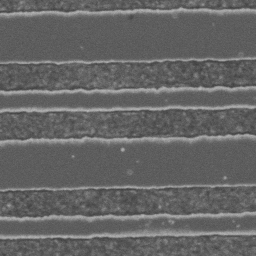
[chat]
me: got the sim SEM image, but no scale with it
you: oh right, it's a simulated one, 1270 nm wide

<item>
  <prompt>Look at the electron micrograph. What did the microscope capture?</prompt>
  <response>lines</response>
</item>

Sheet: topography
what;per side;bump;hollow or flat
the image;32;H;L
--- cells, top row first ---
LLLLLLLLLLLLLLLLLLLLLLLLLLLLLLLL
LLLLLHHHLHHLHHHHHHHHHHHHHHHHHHHH
HHHHHHHHHHHHHHHHHHHHHHHHHHHHHHHH
HHHHHHHHHHHHHHHHHHHHHHHHHHHHHHHH
HHHHHHHHHHHHHHHHHHHHHHHHHHHHHHHH
HHHHHHHHHHHHHHHHHHHHHHHHHHHHHHHH
HHHHHHHHHHHHHHHHHHHHHHHHHHHHHHHH
HHHHHHHHHHHHHHHHHHHHHHHHHHLHHLLL
LLLLLLLLLLLLLLLLLLLLLLLLLLLLLLLL
LLLLLLLLLLLLLLLLLLLLLLLLLLLLLLLL
LLLLLLLLLLLLLLLLLLLLLLLLLLLLLLLL
HHHHHHHHHHHHHHHHHHHHHHHHHHHHHHHH
HHHHHHHHHHHHHHHHHHHHHHHHHHHHHHHH
HHHHHHHHHHHHHHHHHHHHHHHHHHHHHLLL
LLLLLLLLLLLLLLLLLLLLLLLLLLLLLLLL
LLLLLLLLLLLLLLLLLLLLLLLLLLLLLLLL
LLLLLLLLLLLLLLLLLLLLLLLLLLLLLLLL
LLLHHHHHHHHHHHHHHHHHHHHHHHHHHHHH
HHHHHHHHHHHHHHHHHHHHHHHHHHHHHHHH
HHHHHHHHHHHHHHHHHHHHHHHHHHHHHHHH
HHHHHHHHHHHHHHHHHHHHHHHHHHHHHHHH
HHHHHHHHHHHHHHHHHHHHHHHHHHHHHHHH
HHHHHHHHHHHHHHHHHHHHHHHHHHHHHHHH
HHHHHHHHHHHHHHLLLLHHLLLLLLLLLLLL
LLLLLLLLLLLLLLLLLLLLLLLLLLLLLLLL
LLLLLLLLLLLLLLLLLLLLLLLLLLLLLLLL
LLLLLLLLLLLLLLLLLLLLLLLLLLLLLLLL
HHHHHHHHHHHHHHHHHHHHHHHHHHHHHHHH
HHHHHHHHHHHHHHHHHHHHHHHHHHHHHHHH
HHHHHHHHHHHHHHHHHLLLLLLLLLLLLLLL
LLLLLLLLLLLLLLLLLLLLLLLLLLLLLLLL
LLLLLLLLLLLLLLLLLLLLLLLLLLLLLLLL